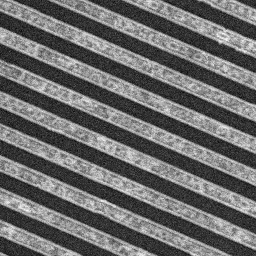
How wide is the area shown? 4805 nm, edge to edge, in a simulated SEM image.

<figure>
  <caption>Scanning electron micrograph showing parallel lines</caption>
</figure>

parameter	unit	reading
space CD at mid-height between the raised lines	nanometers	308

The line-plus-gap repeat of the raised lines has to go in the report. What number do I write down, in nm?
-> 553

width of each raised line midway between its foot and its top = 243 nanometres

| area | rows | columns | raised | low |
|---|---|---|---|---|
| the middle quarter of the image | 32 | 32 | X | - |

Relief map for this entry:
XXXXXX----------XXXXXXXX--------
XXXXXXXX----------XXXXXXXXX-----
--XXXXXXXX-----------XXXXXXXX---
-----XXXXXXXX----------XXXXXXXXX
-------XXXXXXXX----------XXXXXXX
----------XXXXXXX-----------XXXX
X----------XXXXXXXX-----------XX
XXXX----------XXXXXXXX----------
XXXXXX----------XXXXXXXX--------
XXXXXXXX----------XXXXXXXXX-----
--XXXXXXXXX----------XXXXXXXX---
----XXXXXXXXX----------XXXXXXXX-
-------XXXXXXXX----------XXXXXXX
---------XXXXXXXXX----------XXXX
X----------XXXXXXXXX----------XX
XXX-----------XXXXXXXX----------
XXXXXX----------XXXXXXXX--------
XXXXXXXX-----------XXXXXXX------
--XXXXXXXXX----------XXXXXXXX---
----XXXXXXXX-----------XXXXXXXX-
-------XXXXXXXX----------XXXXXXX
---------XXXXXXXX-----------XXXX
X----------XXXXXXXX-----------XX
XXX-----------XXXXXXXX----------
XXXXXX----------XXXXXXXX--------
XXXXXXXX----------XXXXXXXX------
--XXXXXXXX-----------XXXXXXXX---
----XXXXXXXX-----------XXXXXXXX-
-------XXXXXXXX----------XXXXXXX
---------XXXXXXXX-----------XXXX
X----------XXXXXXXX-----------XX
XXX-----------XXXXXXXX----------